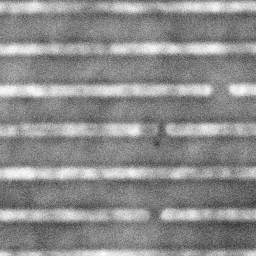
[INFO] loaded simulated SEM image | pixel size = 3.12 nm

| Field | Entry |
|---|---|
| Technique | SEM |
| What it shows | parallel lines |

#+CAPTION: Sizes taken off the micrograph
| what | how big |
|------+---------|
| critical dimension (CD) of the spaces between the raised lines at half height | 101 nm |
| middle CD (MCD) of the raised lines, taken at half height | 29.3 nm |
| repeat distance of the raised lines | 130 nm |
